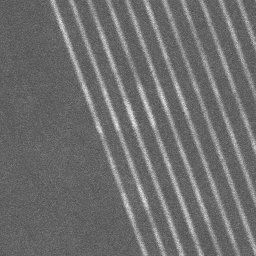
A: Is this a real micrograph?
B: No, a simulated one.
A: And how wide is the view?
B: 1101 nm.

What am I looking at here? parallel lines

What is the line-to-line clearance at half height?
14.6 px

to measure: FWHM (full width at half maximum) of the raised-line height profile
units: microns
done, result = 0.0126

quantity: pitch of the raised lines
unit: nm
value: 75.4